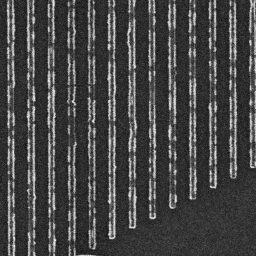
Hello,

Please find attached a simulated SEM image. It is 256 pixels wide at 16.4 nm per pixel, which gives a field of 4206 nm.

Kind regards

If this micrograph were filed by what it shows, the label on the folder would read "parallel lines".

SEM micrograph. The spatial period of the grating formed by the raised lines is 332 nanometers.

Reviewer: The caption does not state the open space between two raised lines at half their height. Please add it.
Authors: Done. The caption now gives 228 nm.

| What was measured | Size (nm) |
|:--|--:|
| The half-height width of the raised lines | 101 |